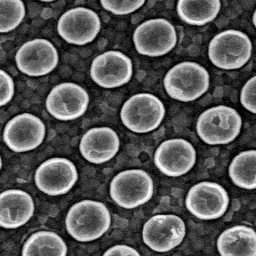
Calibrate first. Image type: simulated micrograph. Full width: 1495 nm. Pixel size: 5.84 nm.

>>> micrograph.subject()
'a regular array of raised bodies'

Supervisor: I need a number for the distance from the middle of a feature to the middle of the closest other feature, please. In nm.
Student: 313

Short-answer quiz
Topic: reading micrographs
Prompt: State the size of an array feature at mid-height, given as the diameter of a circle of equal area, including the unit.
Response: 0.222 um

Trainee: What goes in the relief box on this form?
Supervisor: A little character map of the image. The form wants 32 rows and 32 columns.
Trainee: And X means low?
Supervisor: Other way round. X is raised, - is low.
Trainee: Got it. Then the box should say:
XXX----------XXXXX----XXXXX-----
XXX------XXX--XX------XXXXX-----
XXX-----XXXX-------X---XXX------
XX-----XXXXX-----XXXXX----------
--------XXXX-----XXXXX-----XXXX-
---XXX-----------XXXXX----XXXXX-
--XXXXX-----------XXX-----XXXXX-
--XXXXX-----XXXX----------XXXXX-
--XXXXX----XXXXX------XXX---X---
X-----------XXXX-----XXXXX------
X-----------XXX------XXXXX-----X
XX----XXXXX----------XXXX-----XX
X-----XXXXX-----XXXX----------XX
------XXXXX----XXXXX-------X---X
--XX---XXX-----XXXXX-----XXXXX--
-XXXX-----------XXXX-----XXXXX--
-XXXX------XXX---X-------XXXXX--
-XXXX-----XXXXX-----------XXX---
-XXX------XXXXX-----XXXX--------
-----------XXX-----XXXXX------XX
-----XXXX-----------XXXX-----XXX
-----XXXX-------XX--XXX------XXX
-----XXXX-----XXXXX----------XXX
-----XXXX-----XXXXX-----XXXX----
XXXX----------XXXXX-----XXXX----
XXXX------XX---XX------XXXXX----
XXXX-----XXXX-----------XXXX----
XXX-----XXXXXX------------------
--------XXXXX----------------XX-
----XXX--XXX----------------XXXX
---XXXXX-------------------XXXXX
---XXXXX-----XXXX-----------XXXX